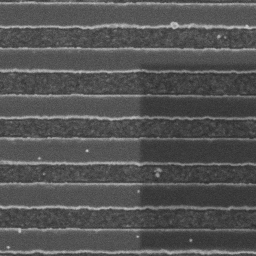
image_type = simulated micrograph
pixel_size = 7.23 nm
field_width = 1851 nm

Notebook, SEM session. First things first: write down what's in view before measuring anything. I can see lines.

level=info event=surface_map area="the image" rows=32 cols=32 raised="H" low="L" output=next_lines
HHHHHHHHHHHHHHHHHHHHHHHHHHHHHHHH
HHHHHHHHHHHHHHHHHHHHHHHHHHHHHHHH
HHHHHHHHHHHHHHHHHHHHHHHHHHHHHHHH
LLLLLLLLLLLLLLLLLLLLLLLLLLLLLLLH
LLLLLLLLLLLLLLLLLLLLLLLLLLLLLLLL
LLLLLLLLLLLLLLLLLLLLLLLLLLLLLLLL
HHHHHHHHHHHHHHHHHHHHHHHHHHHHHHHH
HHHHHHHHHHHHHHHHHHHHHHHHHHHHHHHH
HHHHHHHHHHHHHHHHHHHHHHHHHHHHHHHH
LLLLLLLLLLLLLLLLLLLLLLLLLLLLLLLL
LLLLLLLLLLLLLLLLLLLLLLLLLLLLLLLL
LLLLLLLLLLLLLLLLLLLLLLLLLLLLLLLL
HHHHHHHHHHHHHHHHHHHHHHHHHHHHHHHH
HHHHHHHHHHHHHHHHHHHHHHHHHHHHHHHH
HHHHHHHHHHHHHHHHHHHHHHHHHHHHHHHH
LLLLLLLLLLLLLLLLLLLLLLLLLLLLLLLL
LLLLLLLLLLLLLLLLLLLLLLLLLLLLLLLL
HHHHHHHHHHHHHHHHHHHHHHHHHHHHHHHH
HHHHHHHHHHHHHHHHHHHHHHHHHHHHHHHH
HHHHHHHHHHHHHHHHHHHHHHHHHHHHHHHH
LLLLLLLLLLLLLLLLLHLHLLHHHHHHHHHH
LLLLLLLLLLLLLLLLLLLLLLLLLLLLLLLL
LLLLLLLLLLLLLLLLLLLLLLLLLLLLLLLL
HHHHHHHHHHHHHHHHHHHHHHHHHHHHHHHH
HHHHHHHHHHHHHHHHHHHHHHHHHHHHHHHH
HHHHHHHHHHHHHHHHHHHHHHHHHHHHHHHH
LLLLLLLLLLLLLLLLLLLLLLLLLLLLLLLL
LLLLLLLLLLLLLLLLLLLLLLLLLLLLLLLL
LLLLLLLLLLLLLLLLLLLLLLLLLLLLLLLL
HHHHHHHHHHHHHHHHHHHHHHHHHHHHHHHH
HHHHHHHHHHHHHHHHHHHHHHHHHHHHHHHH
LHHHLHHHLHLLHHHHLHLLLHLLLHHHHHHH